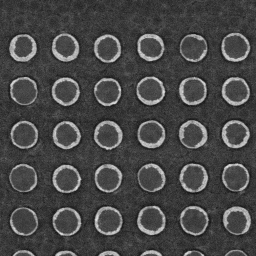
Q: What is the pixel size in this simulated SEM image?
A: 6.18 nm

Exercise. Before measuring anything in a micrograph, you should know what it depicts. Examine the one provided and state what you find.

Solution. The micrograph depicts a regular array of raised bodies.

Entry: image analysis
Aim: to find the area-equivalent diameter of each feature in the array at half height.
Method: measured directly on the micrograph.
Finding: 0.169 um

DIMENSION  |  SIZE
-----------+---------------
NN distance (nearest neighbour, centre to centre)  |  0.26 microns